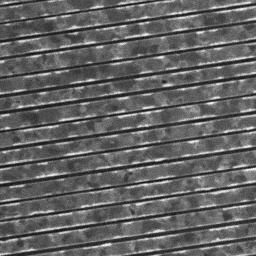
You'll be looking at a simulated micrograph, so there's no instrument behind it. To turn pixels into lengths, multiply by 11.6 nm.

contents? parallel lines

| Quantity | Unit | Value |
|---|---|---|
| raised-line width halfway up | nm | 167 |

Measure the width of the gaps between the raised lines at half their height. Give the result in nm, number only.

40.3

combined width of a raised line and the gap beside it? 207 nm